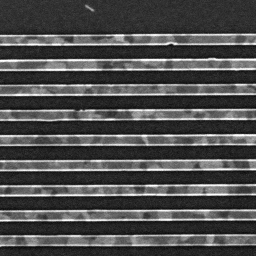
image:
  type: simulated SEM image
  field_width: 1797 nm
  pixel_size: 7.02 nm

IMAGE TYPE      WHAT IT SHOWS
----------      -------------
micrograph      parallel lines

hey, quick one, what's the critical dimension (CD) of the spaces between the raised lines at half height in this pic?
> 106 nm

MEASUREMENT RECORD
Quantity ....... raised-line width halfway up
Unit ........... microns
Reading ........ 0.0685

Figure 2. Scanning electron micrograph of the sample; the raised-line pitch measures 0.176 µm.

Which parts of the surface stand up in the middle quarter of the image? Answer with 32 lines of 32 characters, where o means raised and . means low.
oooooooooooooooooooooooooooooooo
................................
................................
................................
................................
oooooooooooooooooooooooooooooooo
oooooooooooooooooooooooooooooooo
oooooooooooooooooooooooooooooooo
................................
................................
................................
................................
oooooooooooooooooooooooooooooooo
oooooooooooooooooooooooooooooooo
................................
................................
................................
................................
oooooooooooooooooooooooooooooooo
oooooooooooooooooooooooooooooooo
................................
................................
................................
................................
oooooooooooooooooooooooooooooooo
oooooooooooooooooooooooooooooooo
................................
................................
................................
................................
.ooooooooooooooooooooooooooooooo
oooooooooooooooooooooooooooooooo